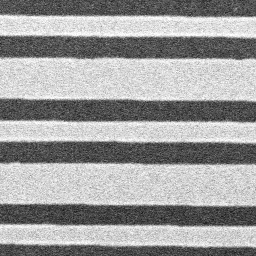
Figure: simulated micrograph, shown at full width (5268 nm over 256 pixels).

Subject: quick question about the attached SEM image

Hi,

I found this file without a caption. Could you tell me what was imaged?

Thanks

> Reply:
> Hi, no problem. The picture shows lines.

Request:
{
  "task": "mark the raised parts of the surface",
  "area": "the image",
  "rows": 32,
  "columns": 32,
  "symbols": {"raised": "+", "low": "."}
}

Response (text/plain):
................................
................................
++++++++++++++++++++++++++++++++
++++++++++++++++++++++++++++++++
................................
................................
................................
++++++++++++++++++++++++++++++++
++++++++++++++++++++++++++++++++
++++++++++++++++++++++++++++++++
++++++++++++++++++++++++++++++++
++++++++++++++++++++++++++++++++
...............................+
................................
................................
++++++++++++++++++++++++++++++++
++++++++++++++++++++++++++++++++
.......+++++++++++++++++++++++++
................................
................................
.++.............................
++++++++++++++++++++++++++++++++
++++++++++++++++++++++++++++++++
++++++++++++++++++++++++++++++++
++++++++++++++++++++++++++++++++
...........+++++++++++++++++++++
................................
................................
++++++++++++++++++++++++++++++++
++++++++++++++++++++++++++++++++
.........+++++++++++++++++++++++
................................